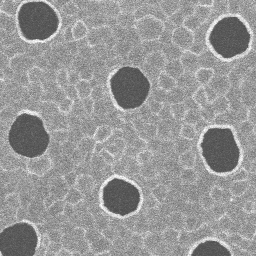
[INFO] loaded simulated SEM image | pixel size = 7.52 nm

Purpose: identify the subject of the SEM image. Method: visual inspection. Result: holes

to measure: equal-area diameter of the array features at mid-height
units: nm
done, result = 301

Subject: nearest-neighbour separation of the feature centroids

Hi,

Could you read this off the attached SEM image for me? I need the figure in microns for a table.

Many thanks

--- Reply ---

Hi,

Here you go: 0.829